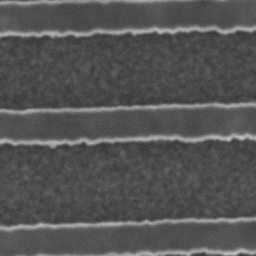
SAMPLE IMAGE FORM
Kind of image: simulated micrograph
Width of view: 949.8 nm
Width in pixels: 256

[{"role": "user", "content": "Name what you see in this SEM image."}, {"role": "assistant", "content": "lines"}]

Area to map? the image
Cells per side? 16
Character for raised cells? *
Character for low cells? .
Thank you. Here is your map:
****************
****************
................
................
................
................
...............*
****************
****************
................
................
................
................
................
****************
****************